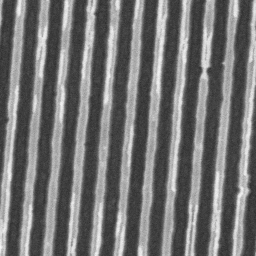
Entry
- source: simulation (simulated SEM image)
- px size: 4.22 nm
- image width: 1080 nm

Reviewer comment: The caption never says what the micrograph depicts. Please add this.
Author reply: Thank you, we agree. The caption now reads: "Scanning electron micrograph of parallel lines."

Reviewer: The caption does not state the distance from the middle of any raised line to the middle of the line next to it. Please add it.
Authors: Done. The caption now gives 99.3 nm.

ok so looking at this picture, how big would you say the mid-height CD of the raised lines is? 9.91 pixels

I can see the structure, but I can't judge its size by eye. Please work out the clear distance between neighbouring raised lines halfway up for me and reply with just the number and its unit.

55.7 nm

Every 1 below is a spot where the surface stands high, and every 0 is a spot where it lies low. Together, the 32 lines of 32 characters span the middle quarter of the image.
10001110001110001110001110001110
10001110001100001110001110001110
10001110001100001110001100001100
10001110001100001100001100001110
00001110001100001100001100001100
00001110001100001100001100001100
00001110001100001100001100001100
00001100001100001100011100001100
00001100001100001100001100011100
00001100001100001100011100011100
00001100001100011100011100011100
00001100001100001100011100011000
00001100011100001100011100011000
00011100011000011100011100011100
00011100011000011100011100011000
00011100011000011000011000011000
00011100011000011000011000011000
00011000011000011100011000011000
00011000011000011000011000011000
00011000011000011000011000011000
00011000011000011000011000111000
00011000011000011000011000111000
00011000011000111000111000111000
00111000111000111000111000111000
00111000011000111000110000110000
00111000111000111000111000111000
00111000111000111000110000110000
00111000110000110000110000110000
00111000110000110000110000110000
00110000110000110000110000110000
00110000110000110000110000110000
00110000110000110000110000110000